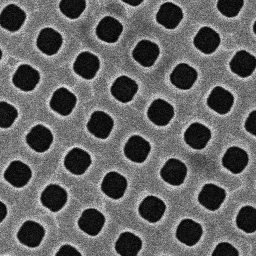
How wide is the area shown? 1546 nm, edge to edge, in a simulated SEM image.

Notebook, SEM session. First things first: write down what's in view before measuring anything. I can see a regular array of holes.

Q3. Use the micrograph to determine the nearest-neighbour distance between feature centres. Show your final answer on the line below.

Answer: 42.7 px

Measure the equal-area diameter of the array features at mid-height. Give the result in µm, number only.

0.159